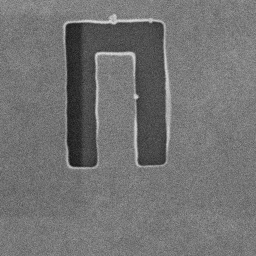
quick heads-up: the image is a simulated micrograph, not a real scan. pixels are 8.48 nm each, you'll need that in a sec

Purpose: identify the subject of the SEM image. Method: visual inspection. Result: groups of lines, slits or small figures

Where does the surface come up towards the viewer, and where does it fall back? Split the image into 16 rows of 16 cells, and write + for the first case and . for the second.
++++++++++++++++
++++......++++++
++++......++++++
++++..++..++++++
++++..++..++++++
++++..++..++++++
++++..+++..+++++
++++..++...+++++
++++..++...+++++
++++..++..++++++
++++++++++++++++
++++++++++++++++
++++++++++++++++
++++++++++++++++
++++++++++++++++
++++++++++++++++